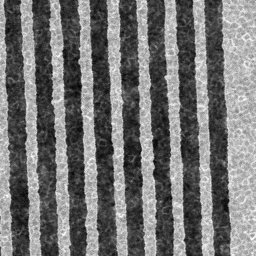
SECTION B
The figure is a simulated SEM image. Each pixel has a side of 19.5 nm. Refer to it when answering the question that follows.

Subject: parallel lines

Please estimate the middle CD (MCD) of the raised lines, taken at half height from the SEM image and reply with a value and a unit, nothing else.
0.205 micrometres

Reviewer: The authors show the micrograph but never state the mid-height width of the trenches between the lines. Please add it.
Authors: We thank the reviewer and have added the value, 344 nm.